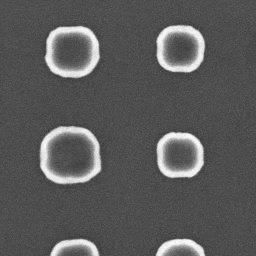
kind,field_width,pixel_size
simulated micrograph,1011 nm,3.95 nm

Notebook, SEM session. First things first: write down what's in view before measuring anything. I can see raised bodies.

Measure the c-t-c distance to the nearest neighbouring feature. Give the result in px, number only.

105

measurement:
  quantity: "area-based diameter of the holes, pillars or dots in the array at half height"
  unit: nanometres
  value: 185